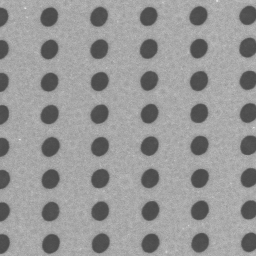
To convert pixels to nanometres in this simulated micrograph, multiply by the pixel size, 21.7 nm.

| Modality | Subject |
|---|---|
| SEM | a regular array of holes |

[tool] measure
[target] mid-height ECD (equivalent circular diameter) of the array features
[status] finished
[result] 0.401 microns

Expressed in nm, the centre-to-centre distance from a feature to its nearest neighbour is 699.